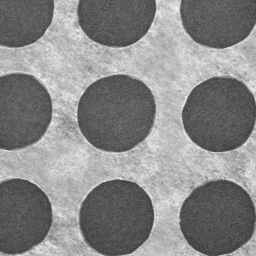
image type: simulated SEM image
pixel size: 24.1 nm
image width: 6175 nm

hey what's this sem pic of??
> holes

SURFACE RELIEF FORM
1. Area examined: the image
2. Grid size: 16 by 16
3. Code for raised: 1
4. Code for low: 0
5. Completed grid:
0001100000100000
0001100001100000
0011110001110001
1111111111111111
1111111111111111
0001100001110001
0001100000110000
0001100000100000
0001100001110000
1111111111111111
1111111111111111
0011110001111001
0001100001110000
0001100000100000
0001100001100000
0011110001110001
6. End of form